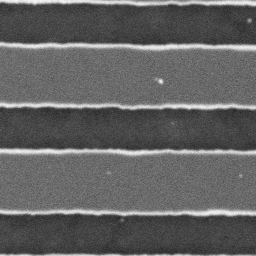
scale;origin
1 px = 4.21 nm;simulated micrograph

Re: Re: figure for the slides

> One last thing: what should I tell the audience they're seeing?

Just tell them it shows lines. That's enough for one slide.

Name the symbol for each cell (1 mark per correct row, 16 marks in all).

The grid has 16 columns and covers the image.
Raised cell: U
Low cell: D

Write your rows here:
DDDDDDDDDDDDDDDD
DDDDDDDDDDDDDDDD
DDDDDDDDDDDDDDDD
UUUUUUUUUUUUUUUU
UUUUUUUUUUUUUUUU
UUUUUUUUUUUUUUUU
UUUUUUUUUUUUUUUU
DDDDDDDDDDDDDDDD
DDDDDDDDDDDDDDDD
UUUUUUUUUUUUUUUD
UUUUUUUUUUUUUUUU
UUUUUUUUUUUUUUUU
UUUUUUUUUUUUUUUU
DDDDDDDDDDDDDDDD
DDDDDDDDDDDDDDDD
DDDDDDDDDDDDDDDD